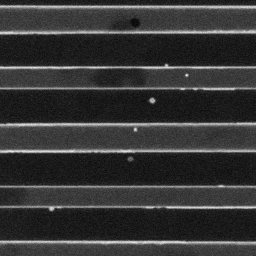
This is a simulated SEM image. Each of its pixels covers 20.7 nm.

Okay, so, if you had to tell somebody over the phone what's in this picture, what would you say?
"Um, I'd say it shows lines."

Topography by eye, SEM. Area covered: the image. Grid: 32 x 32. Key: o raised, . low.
................................
oooooooooooooooooooooooooooooooo
oooooooooooooooooooooooooooooooo
oooooooooooooooooooooooooooooooo
................................
................................
................................
................................
oooooooooooooooooooooooooooooooo
oooooooooooooooooooooooooooooooo
oooooooooooooooooooooooooooooooo
................................
................................
................................
................................
..................oooooooooooooo
oooooooooooooooooooooooooooooooo
oooooooooooooooooooooooooooooooo
oooooooooooooooooooooooooooooooo
................................
................................
................................
................................
oooooooooooooooooooooooooooooooo
oooooooooooooooooooooooooooooooo
oooooooooooooooooooooooooooooooo
................................
................................
................................
................................
oooooooooooooooooooooooooooooooo
oooooooooooooooooooooooooooooooo